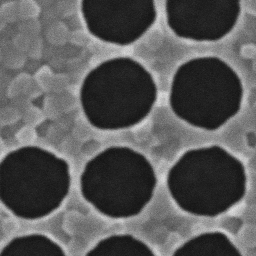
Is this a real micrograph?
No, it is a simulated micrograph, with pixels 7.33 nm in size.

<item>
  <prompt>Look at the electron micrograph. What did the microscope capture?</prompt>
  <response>holes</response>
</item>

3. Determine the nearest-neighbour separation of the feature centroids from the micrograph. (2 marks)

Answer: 0.646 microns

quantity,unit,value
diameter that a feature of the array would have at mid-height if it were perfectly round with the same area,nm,542